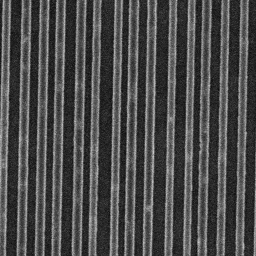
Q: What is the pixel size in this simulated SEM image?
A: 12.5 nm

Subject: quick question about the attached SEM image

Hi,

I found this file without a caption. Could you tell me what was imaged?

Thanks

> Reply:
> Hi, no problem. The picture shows parallel lines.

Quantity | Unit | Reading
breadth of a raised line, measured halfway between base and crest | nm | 96.7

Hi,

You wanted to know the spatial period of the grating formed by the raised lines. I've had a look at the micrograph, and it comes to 228 nm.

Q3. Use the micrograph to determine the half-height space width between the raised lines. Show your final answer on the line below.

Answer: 129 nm